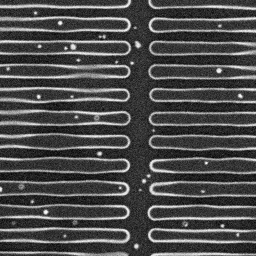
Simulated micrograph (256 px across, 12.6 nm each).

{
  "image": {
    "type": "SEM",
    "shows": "groups of lines, slits or small figures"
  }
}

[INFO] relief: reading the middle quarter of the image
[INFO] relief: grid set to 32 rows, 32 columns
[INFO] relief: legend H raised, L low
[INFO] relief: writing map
LLLLLLLLLLLLLLLLLLLLLLHHHHHHHHHH
HHHHHHHHHHHHHHHHLLLLLHHHHHHHHHHH
HHHHHHHHHHHHHHHHLLLLLHHHHHHHHHHH
LLLLLLLLLLLLLLLLLLLLLLHHHHHLHHHH
LLLLLLLLLLLLLLLLLLLLLLLLLLLLLLLL
LLLLLLLLLLLLLLLLLLLLLLLLLLLLLLLL
HLLLLLLLLLLLLLLLLLLLLLHHHHLLLLLH
HHHHHHHHHHHHHHHHLLLLLLHHHHHHHHHH
HHHHHHHHHHHHHHHHLLLLLLHHHHHHHHHH
LLLLLLLLLLLLLLLLLLLLLLLLLLLLLLLL
LLLLLLLLLLLLLLLLLLLLLLLLLLLLLLLL
LLLLLLLLLLLLLLLLLLLLLLLLLLLLLLLL
HHHHHHHHHHHHHHHHLLLLLLHHHHHHHHHH
HHHHHHHHHHHHHHHHLLLLLHHHHHHHHHHH
HHHHHHHHHHHHHHHHLLLLLLHHHHHHHHHH
LLLLLLLLLLLLLLLLLLLLLLLLLLLLLLLL
LLLLLLLLLLLLLLLLLLLLLLLLLLLLLLLL
LLLLLLLLLLLLLLLLLLLLLLLLLLLLLLLL
HHHHHHHHHHHHHHHHLLLLLLHHHHHHHHHH
HHHHHHHHHHHHHHHHLLLLLHHHHHHHHHHH
HHHHHHHHHHHHHHHHLLLLLLHHHHHHHHHH
LLLLLLLLLLLLLLLLLLLLLLLLLLLLLLLL
LLLLLLLLLLLLLLLLLLLLLLLLLLLLLLLL
LLLLLLLLLLLLLLLLLLLLLLLLLLLLLLLL
HHHHHHHHHHHHHHHHLLLLLLHHHHHHHHHH
HHHHHHHHHHHHHHHHLLLLLLHHHHHHHHHH
HHHHHHHHHHHHHHHHLLLLLLHHHHHHHHHH
LLLLLLLLLLLLLLLLLLLLLLLLLLLLLLLL
LLLLLLLLLLLLLLLLLLLLLLLLLLLLLLLL
LLLLHHHHHHLLLLLLLLLLLLLLLLLLLLLL
HHHHHHHHHHHHHHHHLLLLLLHHHHHHHHHH
HHHHHHHHHHHHHHHHLLLLLLHHHHHHHHHH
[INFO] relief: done